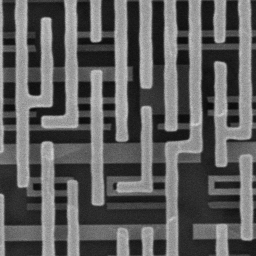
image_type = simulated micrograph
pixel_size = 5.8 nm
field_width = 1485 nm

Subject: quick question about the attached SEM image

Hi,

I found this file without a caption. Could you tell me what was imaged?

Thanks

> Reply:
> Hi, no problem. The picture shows wiring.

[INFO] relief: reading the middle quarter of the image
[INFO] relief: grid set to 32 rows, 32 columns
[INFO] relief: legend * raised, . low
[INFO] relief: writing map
***..........***...***...***....
***..........***...***...***...*
.**....**....***...***...***...*
.**....**....***...***...***...*
.**....**....***...***...***...*
.**....**....***...***...***...*
.**....**....***.........***...*
.**....**....***.........***...*
.**....**....***.........***...*
.**....**....***.........***....
.**....**....***.........***....
.**....**....***...***...***....
***....***...***...***...***....
***....***...***...***...***....
***....***...***....**...***....
***....***...***....**...***....
.......***...***....**....**....
.......***...***...***..........
.......***...***...***.........*
.......***.........***......****
.......**...........**...*******
.......**...........**...*******
.......**...........**...****...
.......**...........**...***....
.......***..........**....**....
.......***..........**....**....
.......***..........**....**....
.......***..........**....**....
.......***..........**...***....
.**....***........****...***....
.**....***...*********...***....
.**....***...*********...***....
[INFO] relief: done